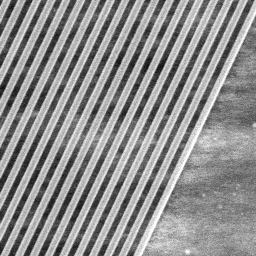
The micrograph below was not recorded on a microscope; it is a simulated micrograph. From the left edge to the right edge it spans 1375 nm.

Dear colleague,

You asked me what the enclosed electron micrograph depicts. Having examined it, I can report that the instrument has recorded parallel lines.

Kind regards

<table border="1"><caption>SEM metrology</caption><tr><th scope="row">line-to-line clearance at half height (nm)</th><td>36.4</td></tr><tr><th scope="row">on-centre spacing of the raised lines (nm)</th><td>71.8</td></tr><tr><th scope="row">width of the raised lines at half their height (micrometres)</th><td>0.0364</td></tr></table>